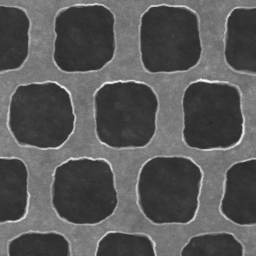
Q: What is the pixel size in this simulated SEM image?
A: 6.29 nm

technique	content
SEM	holes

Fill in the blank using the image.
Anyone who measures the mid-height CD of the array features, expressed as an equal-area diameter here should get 0.423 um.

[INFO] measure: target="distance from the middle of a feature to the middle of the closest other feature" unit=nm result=536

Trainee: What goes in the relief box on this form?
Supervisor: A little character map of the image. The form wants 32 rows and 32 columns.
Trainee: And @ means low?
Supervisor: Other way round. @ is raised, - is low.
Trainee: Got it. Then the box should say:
@@@@@@@@@@@@@@@@@@@@@@@@@@@@@@@@
---@@@@@------@@@@------@@@@@---
----@@@-------@@@@-------@@@----
----@@@-------@@@@-------@@@----
---@@@@-------@@@@-------@@@----
----@@@-------@@@@-------@@@----
---@@@@-------@@@@-------@@@----
---@@@@-------@@@@-------@@@----
--@@@@@------@@@@@------@@@@@---
@@@@@@@@@@@@@@@@@@@@@@@@@@@@@@@@
@@@@@--@@@@@@@----@@@@@@----@@@@
@@------@@@@-------@@@@-------@@
@--------@@@--------@@@-------@@
@--------@@@--------@@@-------@@
@--------@@@-------@@@@-------@@
@--------@@@-------@@@@-------@@
@@-------@@@-------@@@@-------@@
@@------@@@@@------@@@@-------@@
@@@@@--@@@@@@@-@@@@@@@@@@--@@@@@
@@@@@@@@@@@@@@@@@@@@@@@@@@@@@@@@
---@@@@@-----@@@@@------@@@@@---
---@@@@-------@@@@-------@@@----
---@@@@-------@@@--------@@@----
---@@@@-------@@@--------@@@----
---@@@---------@@--------@@@----
---@@@@--------@@--------@@@----
---@@@@-------@@@@------@@@@----
--@@@@@@-----@@@@@@-----@@@@@---
@@@@@@@@@@@@@@@@@@@@@@@@@@@@@@@@
@@@-----@@@@@-----@@@@@@@----@@@
@--------@@@-------@@@@-------@@
@--------@@@-------@@@@-------@@